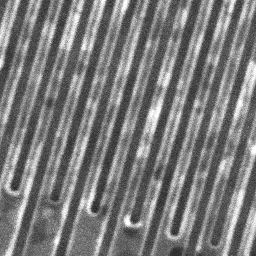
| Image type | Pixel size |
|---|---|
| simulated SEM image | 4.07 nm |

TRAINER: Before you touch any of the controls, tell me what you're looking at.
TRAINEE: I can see parallel lines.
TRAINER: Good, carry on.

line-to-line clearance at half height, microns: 0.0435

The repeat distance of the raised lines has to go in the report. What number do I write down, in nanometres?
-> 84.3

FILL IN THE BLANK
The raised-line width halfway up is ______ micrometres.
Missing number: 0.0401